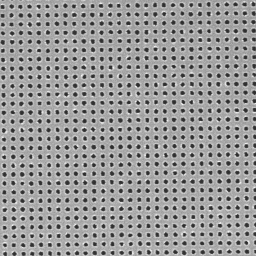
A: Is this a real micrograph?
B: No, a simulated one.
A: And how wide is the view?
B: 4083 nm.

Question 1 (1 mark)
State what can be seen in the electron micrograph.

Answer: a regular array of holes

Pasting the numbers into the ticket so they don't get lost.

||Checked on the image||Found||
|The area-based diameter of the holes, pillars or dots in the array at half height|74.2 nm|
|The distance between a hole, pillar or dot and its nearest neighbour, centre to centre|134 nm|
